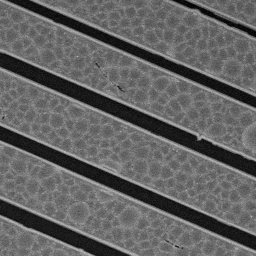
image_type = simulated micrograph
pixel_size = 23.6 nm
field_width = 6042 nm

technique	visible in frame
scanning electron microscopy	one or a few lines or trenches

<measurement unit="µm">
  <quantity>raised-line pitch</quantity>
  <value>1.55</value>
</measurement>